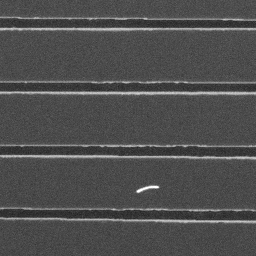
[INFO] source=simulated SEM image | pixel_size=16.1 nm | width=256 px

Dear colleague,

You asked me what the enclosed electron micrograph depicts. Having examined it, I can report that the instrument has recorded lines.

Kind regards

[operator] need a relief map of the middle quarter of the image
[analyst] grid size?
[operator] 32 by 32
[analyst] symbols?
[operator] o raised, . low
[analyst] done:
oooooooooooooooooooooooooooooooo
oooooooooooooooooooooooooooooooo
oooooooooooooooooooooooooooooooo
oooooooooooooooooooooooooooooooo
.......ooooo..ooo..ooooo....o.oo
................................
................................
oooooooooooooooooooooooooooooooo
oooooooooooooooooooooooooooooooo
oooooooooooooooooooooooooooooooo
oooooooooooooooooooooooooooooooo
oooooooooooooooooooooooooooooooo
oooooooooooooooooooooooooooooooo
oooooooooooooooooooooooooooooooo
oooooooooooooooooooooooooooooooo
oooooooooooooooooooooooooooooooo
oooooooooooooooooooooooooooooooo
oooooooooooooooooooooooooooooooo
oooooooooooooooooooooooooooooooo
oooooooooooooooooooooooooooooooo
....oo...ooooooooooooooooooo.oo.
................................
................................
oooooooooooooooooooooooooooooooo
oooooooooooooooooooooooooooooooo
oooooooooooooooooooooooooooooooo
oooooooooooooooooooooooooooooooo
oooooooooooooooooooooooooooooooo
oooooooooooooooooooooooooooooooo
oooooooooooooooooooooooooooooooo
oooooooooooooooooooooooooooooooo
oooooooooooooooooooooooooooooooo